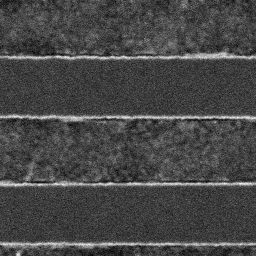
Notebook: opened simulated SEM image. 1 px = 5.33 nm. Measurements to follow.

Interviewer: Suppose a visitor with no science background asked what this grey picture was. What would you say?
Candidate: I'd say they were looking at lines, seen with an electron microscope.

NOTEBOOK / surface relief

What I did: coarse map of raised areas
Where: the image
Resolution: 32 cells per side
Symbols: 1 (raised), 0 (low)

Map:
00000000000000000000000000000000
00000000000000000000000000000000
00000000000000000000000000000000
00000000000000000000000000000000
00000000000000000000000000000000
00000000000000000000000000000000
00000000000000000000000000000000
11111111111111111111111111111111
11111111111111111111111111111111
11111111111111111111111111111111
11111111111111111111111111111111
11111111111111111111111111111111
11111111111111111111111111111111
11111111111111111111111111111111
11111111111111111111111111111111
00000000000000000000000000000000
00000000000000000000000000000000
00000000000000000000000000000000
00000000000000000000000000000000
00000000000000000000000000000000
00000000000000000000000000000000
00000000000000000000000000000000
00000000000000000000000000000000
11111111111111111111111111111111
11111111111111111111111111111111
11111111111111111111111111111111
11111111111111111111111111111111
11111111111111111111111111111111
11111111111111111111111111111111
11111111111111111111111111111111
11111111111111111111111111111111
00000000000000000000000000000000